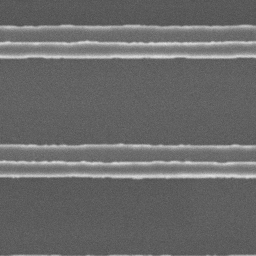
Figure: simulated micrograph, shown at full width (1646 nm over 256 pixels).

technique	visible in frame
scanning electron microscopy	lines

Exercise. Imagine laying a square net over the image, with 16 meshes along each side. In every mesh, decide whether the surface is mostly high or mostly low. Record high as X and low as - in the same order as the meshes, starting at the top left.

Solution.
----------------
----------------
XXXXXXXXXXXXXXXX
XXXXXXXXXXXXXXXX
----------------
----------------
----------------
----------------
----------------
XXXXXXXXXXXXXXXX
XXXXXXXXXXXXXXXX
----------------
----------------
----------------
----------------
----------------